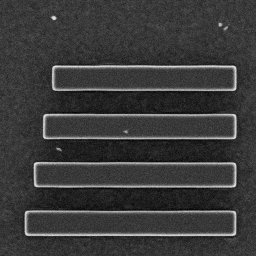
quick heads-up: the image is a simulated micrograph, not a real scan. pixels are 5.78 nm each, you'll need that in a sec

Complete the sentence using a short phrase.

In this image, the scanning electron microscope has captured groups of lines, slits or small figures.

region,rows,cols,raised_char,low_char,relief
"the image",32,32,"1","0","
00000000000000000000000000000000
00000000000000000000000000000000
00000000000000000000000000000000
00000000000000000000000000000000
00000000000000000000000000000000
00000000000000000000000000000000
00000000000000000000000000000000
00000000000000000000000000000000
00000001111111111111111111111000
00000001111111111111111111111000
00000001111111111111111111111000
00000000000000000000000000000000
00000000000000000000000000000000
00000000000000000000000000000000
00000011111111111111111111111000
00000011111111111111111111111000
00000011111111111111111111111000
00000000000000000000000000000000
00000000000000000000000000000000
00000000000000000000000000000000
00000111111111111111111111111000
00001111111111111111111111111000
00001111111111111111111111111000
00000000000000000000000000000000
00000000000000000000000000000000
00000000000000000000000000000000
00011111111111111111111111111000
00011111111111111111111111111000
00011111111111111111111111111000
00000000000000000000000000000000
00000000000000000000000000000000
00000000000000000000000000000000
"